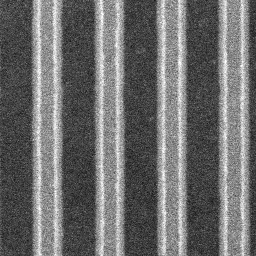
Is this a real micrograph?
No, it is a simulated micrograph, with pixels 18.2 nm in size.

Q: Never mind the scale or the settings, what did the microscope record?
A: parallel lines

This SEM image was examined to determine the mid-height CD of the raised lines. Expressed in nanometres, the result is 386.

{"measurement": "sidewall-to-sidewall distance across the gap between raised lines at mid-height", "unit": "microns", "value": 0.74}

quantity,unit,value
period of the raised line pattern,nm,1130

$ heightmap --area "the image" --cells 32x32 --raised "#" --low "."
.....##.....###.....###.....###.
.....##.....###.....###.....###.
.....##......##.....###.....###.
.....##.....###.....###.....###.
.....##.....###.....###.....###.
.....##.....###.....###.....###.
.....##.....###.....###.....###.
.....##.....###.....###.....###.
.....##.....###.....###.....###.
.....##.....###.....###.....###.
.....##.....###.....###.....###.
.....##......##.....###.....###.
.....##.....###.....###.....###.
.....##.....###.....###.....##..
.....##.....###.....###.....###.
.....##.....###.....###.....###.
.....##.....###.....###.....###.
.....##.....###.....###.....###.
.....##.....###.....###.....###.
.....##.....###.....###.....###.
.....##.....###.....###.....###.
.....##.....###.....###.....###.
.....##......##.....###.....###.
.....##......##.....###.....###.
.....##......##.....###.....###.
.....##......##.....###.....###.
.....##.....###.....###.....###.
.....##......##.....###.....###.
.....##.....###.....###.....###.
.....##.....###.....###.....###.
.....##.....###.....###.....###.
.....##.....###.....###.....###.